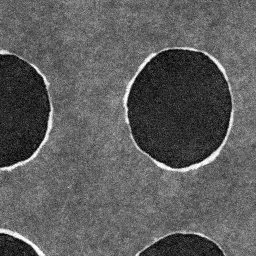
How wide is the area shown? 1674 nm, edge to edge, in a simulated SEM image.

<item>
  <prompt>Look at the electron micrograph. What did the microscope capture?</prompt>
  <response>holes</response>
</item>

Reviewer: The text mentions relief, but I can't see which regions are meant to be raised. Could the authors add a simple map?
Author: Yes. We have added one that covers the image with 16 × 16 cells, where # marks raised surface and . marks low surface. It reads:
################
################
################
.#########...###
..#######.....##
...#####......##
...#####.......#
...#####......##
...#####......##
..#######.....##
###########.####
################
################
################
################
..#######.....##